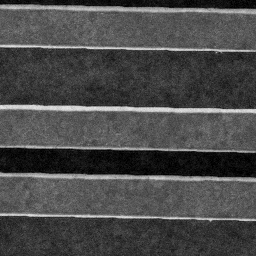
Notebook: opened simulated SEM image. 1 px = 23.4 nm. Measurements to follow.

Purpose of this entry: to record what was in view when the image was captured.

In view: lines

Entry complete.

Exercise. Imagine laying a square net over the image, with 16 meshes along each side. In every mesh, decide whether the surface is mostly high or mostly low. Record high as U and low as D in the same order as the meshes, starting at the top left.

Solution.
UUUUUUUDDDDDDDDD
UUUUUUUUUUUUUUUU
UUUUUUUUUUUUUUUU
DDDDDDDDDDDDDDDD
DDDDDDDDDDDDDDDD
DDDDDDDDDDDDDDDD
DDDDDDDDDDDDDDDD
UUUUUUUUUUUUUUUU
UUUUUUUUUUUUUUUU
DDDDDDDDDDDDDDDU
DDDDDDDDDDDDDDDD
UUUUUUUUUUUUUUUU
UUUUUUUUUUUUUUUU
DDDDDUUUUUUUUUUU
DDDDDDDDDDDDDDDD
DDDDDDDDDDDDDDDD